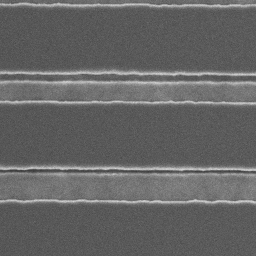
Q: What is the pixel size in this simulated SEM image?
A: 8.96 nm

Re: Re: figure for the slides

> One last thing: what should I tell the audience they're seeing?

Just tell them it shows lines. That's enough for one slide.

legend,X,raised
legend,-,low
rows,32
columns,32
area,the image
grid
--XX----------------------------
XXXXXXXXXXXXXXXXXXXXXXXXXXXXXXXX
XXXXXXXXXXXXXXXXXXXXXXXXXXXXXXXX
XXXXXXXXXXXXXXXXXXXXXXXXXXXXXXXX
XXXXXXXXXXXXXXXXXXXXXXXXXXXXXXXX
XXXXXXXXXXXXXXXXXXXXXXXXXXXXXXXX
XXXXXXXXXXXXXXXXXXXXXXXXXXXXXXXX
XXXXXXXXXXXXXXXXXXXXXXXXXXXXXXXX
XXXXXXXXXXXXXXXXXXXXXXXXXXXXXXXX
--------------------------------
--------------------------------
--------------------------------
--------------------------------
XXXXXXXXXXXXXXXXXXXXXXXXXXXXXXXX
XXXXXXXXXXXXXXXXXXXXXXXXXXXXXXXX
XXXXXXXXXXXXXXXXXXXXXXXXXXXXXXXX
XXXXXXXXXXXXXXXXXXXXXXXXXXXXXXXX
XXXXXXXXXXXXXXXXXXXXXXXXXXXXXXXX
XXXXXXXXXXXXXXXXXXXXXXXXXXXXXXXX
XXXXXXXXXXXXXXXXXXXXXXXXXXXXXXXX
XXXXXXXXXXXXXXXXXXXXXXXXXXXXXXXX
--------------------------------
--------------------------------
--------------------------------
--------------------------------
XXXXXXXXXXXXXXXXXXXXXXXXXXXXXXXX
XXXXXXXXXXXXXXXXXXXXXXXXXXXXXXXX
XXXXXXXXXXXXXXXXXXXXXXXXXXXXXXXX
XXXXXXXXXXXXXXXXXXXXXXXXXXXXXXXX
XXXXXXXXXXXXXXXXXXXXXXXXXXXXXXXX
XXXXXXXXXXXXXXXXXXXXXXXXXXXXXXXX
XXXXXXXXXXXXXXXXXXXXXXXXXXXXXXXX